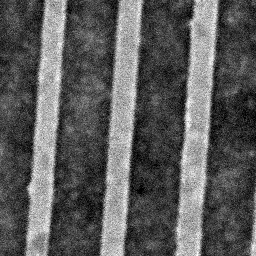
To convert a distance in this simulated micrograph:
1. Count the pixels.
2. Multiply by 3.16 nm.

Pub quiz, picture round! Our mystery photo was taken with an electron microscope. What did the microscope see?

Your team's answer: one or a few lines or trenches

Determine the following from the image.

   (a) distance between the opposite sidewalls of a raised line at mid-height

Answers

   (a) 63.8 nanometres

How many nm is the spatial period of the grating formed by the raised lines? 238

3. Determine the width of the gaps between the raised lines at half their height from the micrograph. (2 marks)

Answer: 0.174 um